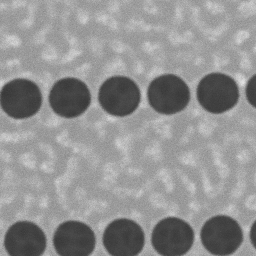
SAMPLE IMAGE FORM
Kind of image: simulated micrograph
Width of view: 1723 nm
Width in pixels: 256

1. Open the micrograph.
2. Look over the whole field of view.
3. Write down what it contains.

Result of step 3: holes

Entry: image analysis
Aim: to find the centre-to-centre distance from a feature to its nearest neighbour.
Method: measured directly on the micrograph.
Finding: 48.9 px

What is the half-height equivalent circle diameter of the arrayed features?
286 nm